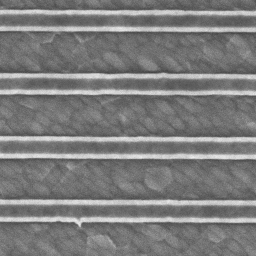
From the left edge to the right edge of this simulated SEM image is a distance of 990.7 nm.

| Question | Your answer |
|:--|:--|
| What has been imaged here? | one or a few lines or trenches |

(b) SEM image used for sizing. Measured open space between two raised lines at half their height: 0.178 microns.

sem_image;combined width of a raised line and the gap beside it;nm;246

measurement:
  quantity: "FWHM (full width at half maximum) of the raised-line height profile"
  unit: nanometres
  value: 70.2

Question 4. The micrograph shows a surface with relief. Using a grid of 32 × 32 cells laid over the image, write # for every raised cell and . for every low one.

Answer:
................................
##..##..........................
################################
################################
................................
................................
................................
................................
................................
#######...###..###############..
################################
#############.##################
................................
................................
................................
................................
................................
################################
################################
################################
................................
................................
................................
................................
................................
################################
################################
.##......##..............#######
................................
................................
................................
................................